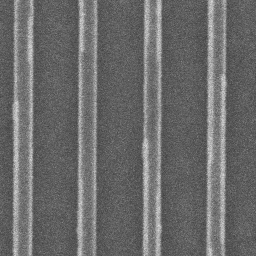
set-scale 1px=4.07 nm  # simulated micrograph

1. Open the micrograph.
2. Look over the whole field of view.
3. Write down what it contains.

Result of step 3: one or a few lines or trenches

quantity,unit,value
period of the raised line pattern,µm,0.263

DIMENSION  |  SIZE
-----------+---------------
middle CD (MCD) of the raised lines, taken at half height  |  67.7 nanometres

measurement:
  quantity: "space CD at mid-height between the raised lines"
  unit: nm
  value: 198